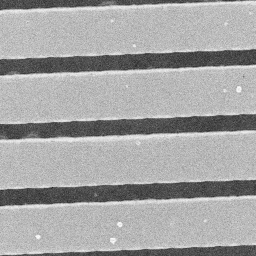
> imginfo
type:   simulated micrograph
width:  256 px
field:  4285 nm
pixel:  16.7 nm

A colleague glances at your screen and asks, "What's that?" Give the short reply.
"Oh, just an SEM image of lines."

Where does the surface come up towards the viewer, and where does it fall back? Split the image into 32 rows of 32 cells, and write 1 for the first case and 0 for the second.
00000000000000000000000011111111
11111111111111111111111111111111
11111111111111111111111111111111
11111111111111111111111111111111
11111111111111111111111111111111
11111111111111111111111111111111
11111111111111111111110000000000
00000000000000000000000000000000
00000000000000000000000001111111
01111111111111111111111111111111
11111111111111111111111111111111
11111111111111111111111111111111
11111111111111111111111111111111
11111111111111111111111111111111
11111111111111111111111100000000
00000000000000000000000000000000
00000000000000000000000000000011
00011111111111111111111111111111
11111111111111111111111111111111
11111111111111111111111111111111
11111111111111111111111111111111
11111111111111111111111111111111
11111111111111111111111111111000
11110000000000000000000000000000
00000000000000000000000000000000
00000000011111111111111111111111
11111111111111111111111111111111
11111111111111111111111111111111
11111111111111111111111111111111
11111111111111111111111111111111
11111111111111111111111111111111
11111111100000000000000000000000